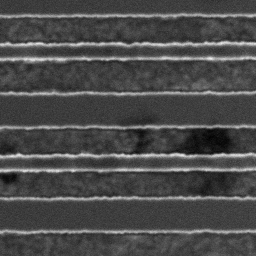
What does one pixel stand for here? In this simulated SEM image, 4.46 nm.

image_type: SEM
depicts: lines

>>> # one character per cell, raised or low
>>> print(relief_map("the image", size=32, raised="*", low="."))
********************************
********************************
................................
................................
................................
********************************
********************************
................................
................................
................................
................................
................................
********************************
********************************
********************************
********************************
................................
................................
................................
.*******************************
********************************
................................
................................
................................
................................
********************************
********************************
********************************
********************************
................................
................................
................................